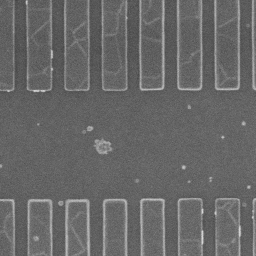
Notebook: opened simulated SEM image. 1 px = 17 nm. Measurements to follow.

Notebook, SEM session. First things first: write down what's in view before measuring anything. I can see wiring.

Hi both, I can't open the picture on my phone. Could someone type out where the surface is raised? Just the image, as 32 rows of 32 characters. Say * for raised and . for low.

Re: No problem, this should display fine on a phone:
**.***..***..***..**..***..***..
**.***..***..***..**..***..***..
**.***..***..***..**..***..***..
**.***..***..***..**..***..***..
**.***..***..***..**..***..***..
**..**..***..***..**..***..***..
**..**..***..***..**..***..***..
**..**..***..***..**..***..***..
**..**..***..***..**..***..***..
**..**..***..***..**..***..***..
**..**..***..***..**..***..***..
................................
................................
................................
................................
................................
................................
................................
............*...................
................................
................................
................................
................................
................................
................................
**..**..***..***..**..***..***..
**..**..***..***..**..***..***..
**..**..***..***..**..***..***..
**..**..***..***..**..***..***..
**..**..***..***..**..***..***..
**..**..***..***..**..***..***..
**..**..***..***..**..***..***..